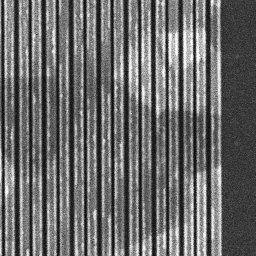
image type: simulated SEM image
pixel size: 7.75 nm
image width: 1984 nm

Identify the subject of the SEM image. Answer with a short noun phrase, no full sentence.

parallel lines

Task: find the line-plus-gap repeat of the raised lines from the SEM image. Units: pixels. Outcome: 13.8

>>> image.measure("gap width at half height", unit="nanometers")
32.4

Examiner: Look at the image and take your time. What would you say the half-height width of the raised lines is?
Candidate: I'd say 71.7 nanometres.